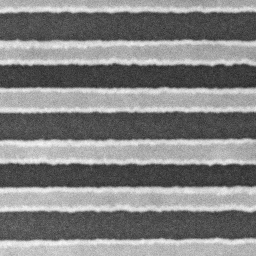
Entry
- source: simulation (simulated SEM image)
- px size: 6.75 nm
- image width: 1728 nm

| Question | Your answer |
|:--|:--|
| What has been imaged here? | lines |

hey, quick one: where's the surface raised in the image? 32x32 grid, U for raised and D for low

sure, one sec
UUUUUUUUUUUUUUUUUUUUUUUUUUUUUUUU
UUDUDDUDDUDUDUUDDDDDDDUUDDDDDUDD
DDDDDDDDDDDDDDDDDDDDDDDDDDDDDDDD
DDDDDDDDDDDDDDDDDDDDDDDDDDDDDDDD
DDDDDDDDDDDDDDDDDDDDDDDDDDDDDDDD
UUUUUUUUUUUUUUUUUUUUUUUUUUUUUUUU
UUUUUUUUUUUUUUUUUUUUUUUUUUUUUUUU
UUUUUUUUUUUUUUUUUUUUUUUUUUUUUUUU
DDDDDDDDDDDDDDDDDDDDDDDDDDDDDDDD
DDDDDDDDDDDDDDDDDDDDDDDDDDDDDDDD
DDDDDDDDDDDDDDDDDDDDDDDDDDDDDDDD
UUUUUUUUUUUUUUUUUUUUUUUUUUUUUUUU
UUUUUUUUUUUUUUUUUUUUUUUUUUUUUUUU
UUUUUUUUUUUUUUUUUUUUUUUUUUUUUUUU
DDDDDDDDDDDDDDDDDDDDDDDDDDDDDDDD
DDDDDDDDDDDDDDDDDDDDDDDDDDDDDDDD
DDDDDDDDDDDDDDDDDDDDDDDDDDDDDDDD
DDDDDDDDDDDDDUDDDDUUUUUUUUUUUUUU
UUUUUUUUUUUUUUUUUUUUUUUUUUUUUUUU
UUUUUUUUUUUUUUUUUUUUUUUUUUUUUUUU
DDDDDDUDDDDDDDDUDUDDDDUDUDUDUDUD
DDDDDDDDDDDDDDDDDDDDDDDDDDDDDDDD
DDDDDDDDDDDDDDDDDDDDDDDDDDDDDDDD
UUUUUUUUUUUUUUUUUUUUUUUUUUUUUUUU
UUUUUUUUUUUUUUUUUUUUUUUUUUUUUUUU
UUUUUUUUUUUUUUUUUUUUUUUUUUUUUUUU
DDDDDDDDDDDDDDDDDDDDDDDDDDDDDDDD
DDDDDDDDDDDDDDDDDDDDDDDDDDDDDDDD
DDDDDDDDDDDDDDDDDDDDDDDDDDDDDDDD
DDDDDDDDDDDDDDDDDDDDDDDDDDDDDDDD
UUUUUUUUUUUUUUUUUUUUUUUUUUUUUUUU
UUUUUUUUUUUUUUUUUUUUUUUUUUUUUUUU